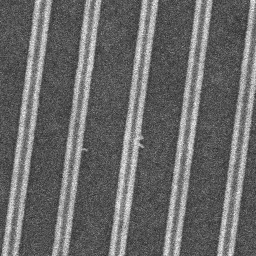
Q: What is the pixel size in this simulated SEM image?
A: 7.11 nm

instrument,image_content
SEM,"parallel lines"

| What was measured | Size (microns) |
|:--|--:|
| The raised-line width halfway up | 0.0837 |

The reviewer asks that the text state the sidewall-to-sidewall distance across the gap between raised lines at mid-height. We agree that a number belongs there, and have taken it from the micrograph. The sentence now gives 299 nm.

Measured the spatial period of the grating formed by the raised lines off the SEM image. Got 379 nanometers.